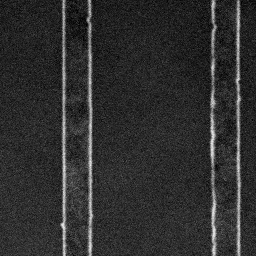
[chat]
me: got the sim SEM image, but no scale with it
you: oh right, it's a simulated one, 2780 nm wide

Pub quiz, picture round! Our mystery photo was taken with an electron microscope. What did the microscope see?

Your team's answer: one or a few lines or trenches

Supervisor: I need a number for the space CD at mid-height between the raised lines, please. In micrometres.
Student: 1.32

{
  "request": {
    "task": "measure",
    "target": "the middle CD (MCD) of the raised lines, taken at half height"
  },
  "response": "293 nm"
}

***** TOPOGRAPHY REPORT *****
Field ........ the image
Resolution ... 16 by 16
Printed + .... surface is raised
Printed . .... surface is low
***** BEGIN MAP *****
....++.......++.
....++.......++.
....++.......++.
....++.......++.
....++.......++.
....++.......++.
....++.......++.
....++.......++.
....++.......++.
....++.......++.
....++.......++.
....++.......++.
....++.......++.
....++.......++.
....++.......++.
....++.......++.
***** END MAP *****